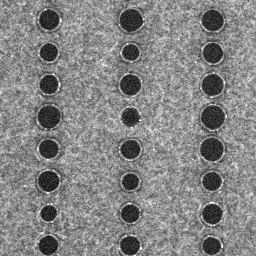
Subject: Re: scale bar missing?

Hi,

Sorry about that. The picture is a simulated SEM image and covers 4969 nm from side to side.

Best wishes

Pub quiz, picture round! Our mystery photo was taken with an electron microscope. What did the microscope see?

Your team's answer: a regular array of raised bodies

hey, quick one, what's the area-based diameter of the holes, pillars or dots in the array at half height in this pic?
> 412 nm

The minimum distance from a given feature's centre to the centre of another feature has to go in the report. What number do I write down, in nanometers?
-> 624